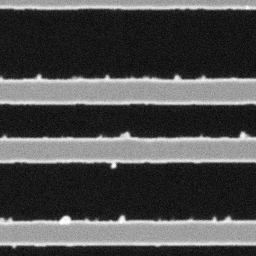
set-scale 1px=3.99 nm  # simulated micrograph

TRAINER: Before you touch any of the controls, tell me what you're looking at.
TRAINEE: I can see lines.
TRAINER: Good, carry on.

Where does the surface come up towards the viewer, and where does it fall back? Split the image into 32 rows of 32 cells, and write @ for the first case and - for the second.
@@@@@@@@@@@@@@@@@@@@@@@@@@@@@@@@
--------------------------------
--------------------------------
--------------------------------
--------------------------------
--------------------------------
--------------------------------
--------------------------------
--------------------------------
--------------------------------
@@@@@@@@@@@@@@@@@@@@@@@@@@@@@@@@
@@@@@@@@@@@@@@@@@@@@@@@@@@@@@@@@
@@@@@@@@@@@@@@@@@@@@@@@@@@@@@@@@
--------------------------------
--------------------------------
--------------------------------
--------------------------------
@@@@@@@@@@@@@@@@@@@@@@@@@@@@@@@@
@@@@@@@@@@@@@@@@@@@@@@@@@@@@@@@@
@@@@@@@@@@@@@@@@@@@@@@@@@@@@@@@@
--------------------------------
--------------------------------
--------------------------------
--------------------------------
--------------------------------
--------------------------------
--------------------------------
-------@@------@----------------
@@@@@@@@@@@@@@@@@@@@@@@@@@@@@@@@
@@@@@@@@@@@@@@@@@@@@@@@@@@@@@@@@
@@@@@@@@@@@@@@@@@@@@@@@@@@@@@@@@
--------------------------------